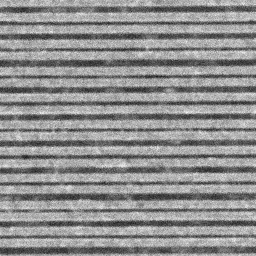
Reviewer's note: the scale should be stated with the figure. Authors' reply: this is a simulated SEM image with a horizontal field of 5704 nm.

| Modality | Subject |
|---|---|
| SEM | parallel lines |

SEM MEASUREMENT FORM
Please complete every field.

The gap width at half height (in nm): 153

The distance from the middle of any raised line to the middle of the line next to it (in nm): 296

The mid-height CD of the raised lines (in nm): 173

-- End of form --